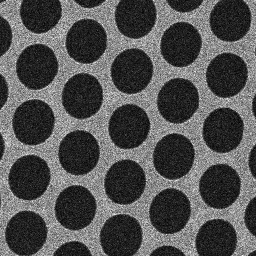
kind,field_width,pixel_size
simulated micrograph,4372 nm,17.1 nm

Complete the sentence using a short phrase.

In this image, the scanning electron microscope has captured a regular array of holes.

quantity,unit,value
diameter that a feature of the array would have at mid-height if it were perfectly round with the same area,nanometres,744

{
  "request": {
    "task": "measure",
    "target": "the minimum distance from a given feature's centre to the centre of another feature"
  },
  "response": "930 nm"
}